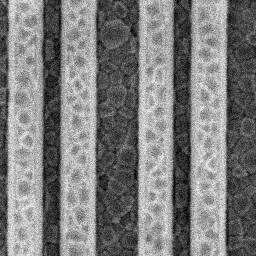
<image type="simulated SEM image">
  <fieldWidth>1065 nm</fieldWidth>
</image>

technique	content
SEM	one or a few lines or trenches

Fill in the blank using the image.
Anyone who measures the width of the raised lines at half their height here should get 117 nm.